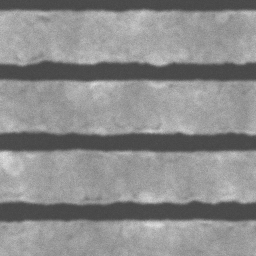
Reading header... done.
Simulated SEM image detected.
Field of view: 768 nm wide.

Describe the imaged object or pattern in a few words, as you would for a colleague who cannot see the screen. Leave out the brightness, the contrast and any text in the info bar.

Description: lines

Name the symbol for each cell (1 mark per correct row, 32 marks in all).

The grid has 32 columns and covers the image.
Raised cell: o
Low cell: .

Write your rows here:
................................
oooooooooooooooooooooooooooooooo
oooooooooooooooooooooooooooooooo
oooooooooooooooooooooooooooooooo
oooooooooooooooooooooooooooooooo
oooooooooooooooooooooooooooooooo
oooooooooooooooooooooooooooooooo
oooooooooooooooooooooooooooooooo
................................
................................
oooooooooooooooooooooooooooooooo
oooooooooooooooooooooooooooooooo
oooooooooooooooooooooooooooooooo
oooooooooooooooooooooooooooooooo
oooooooooooooooooooooooooooooooo
oooooooooooooooooooooooooooooooo
oooooooooooooooooooooooooooooooo
................................
................................
oooooooooooooooooooooooooooooooo
oooooooooooooooooooooooooooooooo
oooooooooooooooooooooooooooooooo
oooooooooooooooooooooooooooooooo
oooooooooooooooooooooooooooooooo
oooooooooooooooooooooooooooooooo
.....o...oo.oo..................
................................
................................
oooooooooooooooooooooooooooooooo
oooooooooooooooooooooooooooooooo
oooooooooooooooooooooooooooooooo
oooooooooooooooooooooooooooooooo